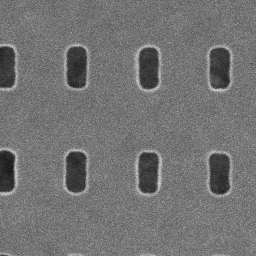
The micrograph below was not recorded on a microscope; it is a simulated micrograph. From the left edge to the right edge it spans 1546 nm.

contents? holes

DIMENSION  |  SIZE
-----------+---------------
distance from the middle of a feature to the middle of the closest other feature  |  431 nanometres